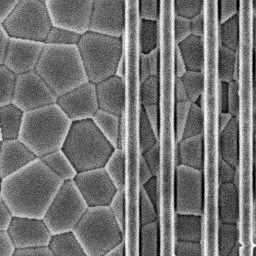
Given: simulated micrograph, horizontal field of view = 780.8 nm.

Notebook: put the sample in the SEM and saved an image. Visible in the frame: parallel lines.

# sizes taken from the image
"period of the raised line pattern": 115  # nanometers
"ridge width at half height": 38.9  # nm